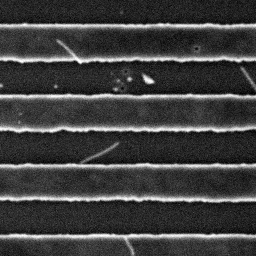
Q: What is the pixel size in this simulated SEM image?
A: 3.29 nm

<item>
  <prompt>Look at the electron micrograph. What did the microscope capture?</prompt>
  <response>lines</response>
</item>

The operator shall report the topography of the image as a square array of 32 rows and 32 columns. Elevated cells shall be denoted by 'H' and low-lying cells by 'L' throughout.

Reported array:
LLLLLLLLLLLLLLLLLLLLLLLLLLLLLLLL
LLLLLLLLLLLLLLLLLLLLLLLLLLLLLLLL
LLLLLLLLLLLLLLLLLLLLLLLLLLLLLLLL
HHHHHHHHHHHHHHHHHHHHHHHHHHHHHHHH
HHHHHHHHHHHHHHHHHHHHHHHHHHHHHHHH
HHHHHHHHHHHHHHHHHHHHHHHHHHHHHHHH
HHHHHHHHHHHHHHHHHHHHHHHHHHHHHHHH
HHHHHHHHHHHHHHHHHLHHHLHHHHHLLHHH
LLLLLLLLLLLLLLLLLLLLLLLLLLLLLLLL
LLLLLLLLLLLLLLLLLLLLLLLLLLLLLLLL
LLLLLLLLLLLLLLLLLLLLLLLLLLLLLLLL
LLLLLLLLLLLLLLLLLLLLLLLLLLLLLLLL
HHHHHHHHHHHHHHHHHHHHHHHHHHHHHHHH
HHHHHHHHHHHHHHHHHHHHHHHHHHHHHHHH
HHHHHHHHHHHHHHHHHHHHHHHHHHHHHHHH
HHHHHHHHHHHHHHHHHHHHHHHHHHHHHHHH
LLLLLLLLLLLLLLLLLLLLLLLLLLLLLLLL
LLLLLLLLLLLLLLLLLLLLLLLLLLLLLLLL
LLLLLLLLLLLLLLLLLLLLLLLLLLLLLLLL
LLLLLLLLLLLLLLLLLLLLLLLLLLLLLLLL
LLLLLLLLLLLLLLLLLLLLLLLLLLLLLLLL
HHHHHHHHHHHHHHHHHHHHHHHHHHHHHHHH
HHHHHHHHHHHHHHHHHHHHHHHHHHHHHHHH
HHHHHHHHHHHHHHHHHHHHHHHHHHHHHHHH
HHHHHHHHHHHHHHHHHHHHHHHHHHHHHHHH
LLLLLLLLLLLLLLLLLLLLLLLLLLLLLLLL
LLLLLLLLLLLLLLLLLLLLLLLLLLLLLLLL
LLLLLLLLLLLLLLLLLLLLLLLLLLLLLLLL
LLLLLLLLLLLLLLLLLLLLLLLLLLLLLLLL
HHHHHHHHHHHHHHHHHHHHHHHHHHHHHHHH
HHHHHHHHHHHHHHHHHHHHHHHHHHHHHHHH
HHHHHHHHHHHHHHHHHHHHHHHHHHHHHHHH